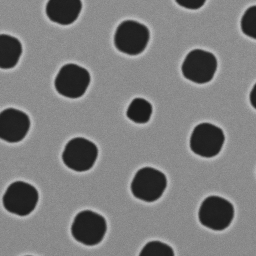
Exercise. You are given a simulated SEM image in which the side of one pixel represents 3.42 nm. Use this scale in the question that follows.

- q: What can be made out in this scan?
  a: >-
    a regular array of holes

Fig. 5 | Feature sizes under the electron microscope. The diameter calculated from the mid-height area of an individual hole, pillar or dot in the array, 116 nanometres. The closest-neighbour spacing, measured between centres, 252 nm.